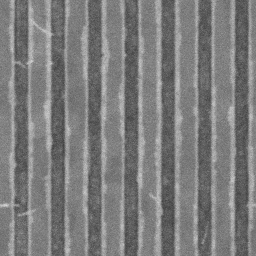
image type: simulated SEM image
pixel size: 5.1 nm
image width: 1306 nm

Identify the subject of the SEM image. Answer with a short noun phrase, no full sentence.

parallel lines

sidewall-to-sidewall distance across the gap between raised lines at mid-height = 0.0809 µm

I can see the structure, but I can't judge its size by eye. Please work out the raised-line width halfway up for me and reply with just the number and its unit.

108 nanometres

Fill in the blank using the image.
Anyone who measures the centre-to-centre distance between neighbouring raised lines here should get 187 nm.